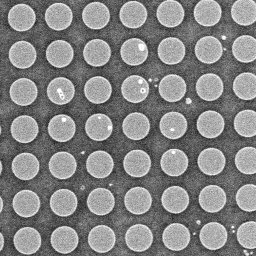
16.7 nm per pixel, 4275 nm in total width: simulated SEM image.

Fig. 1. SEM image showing an array of small figures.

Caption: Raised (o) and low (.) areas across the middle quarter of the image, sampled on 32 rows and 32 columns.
................................
................................
................................
.......ooo......ooo......oooo...
oo....ooooo....oooooo...oooooo..
oo...ooooooo...oooooo...oooooo..
oo...ooooooo...oooooo...oooooo..
oo...ooooooo...oooooo...oooooo..
oo....ooooo....ooooo.....oooo...
o......ooo.......o..............
................................
................................
.................oo.......ooo...
oo....ooooo....oooooo....ooooo..
oo....oooooo...oooooo...ooooooo.
ooo...oooooo...oooooo...ooooooo.
ooo...oooooo...oooooo...oooooo..
oo....oooooo...oooooo....ooooo..
oo.....oooo.....ooo.......oo....
................................
................................
..........................ooo...
o......oooo.....ooooo....ooooo..
oo....oooooo...oooooo...ooooooo.
ooo...oooooo...ooooooo..ooooooo.
ooo...oooooo...oooooo...ooooooo.
ooo...oooooo...oooooo....ooooo..
oo.....oooo.....oooo......ooo...
o...............................
................................
................................
o.......ooo......oooo.....oooo..